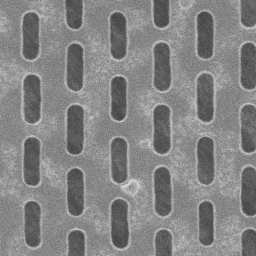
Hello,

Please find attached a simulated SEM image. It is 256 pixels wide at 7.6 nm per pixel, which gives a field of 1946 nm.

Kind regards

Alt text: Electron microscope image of a regular array of holes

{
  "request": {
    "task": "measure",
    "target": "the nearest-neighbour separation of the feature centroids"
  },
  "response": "404 nanometres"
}